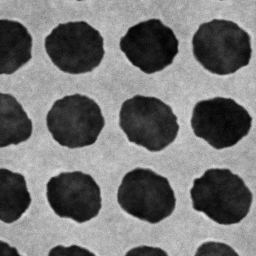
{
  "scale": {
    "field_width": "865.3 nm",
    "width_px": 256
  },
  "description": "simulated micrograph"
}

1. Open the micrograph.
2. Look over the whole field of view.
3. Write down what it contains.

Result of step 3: a regular array of holes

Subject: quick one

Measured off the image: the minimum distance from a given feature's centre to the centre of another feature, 72 px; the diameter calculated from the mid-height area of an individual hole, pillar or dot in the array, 0.185 um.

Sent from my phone